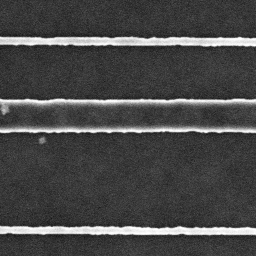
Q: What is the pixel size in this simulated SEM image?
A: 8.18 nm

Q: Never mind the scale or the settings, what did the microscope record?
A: lines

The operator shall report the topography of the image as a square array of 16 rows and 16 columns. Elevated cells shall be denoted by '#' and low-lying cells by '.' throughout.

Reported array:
................
................
................
................
................
................
################
################
................
................
................
................
................
................
................
................